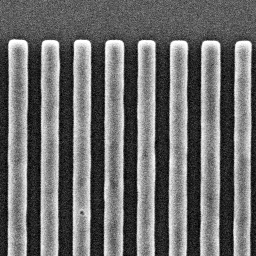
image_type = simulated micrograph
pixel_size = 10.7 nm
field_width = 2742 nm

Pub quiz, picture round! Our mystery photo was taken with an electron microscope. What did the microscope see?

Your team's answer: wiring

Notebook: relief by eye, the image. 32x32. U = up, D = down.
DDDDDDDDDDDDDDDDDDDDDDDDDDDDDDDD
DDDDDDDDDDDDDDDDDDDDDDDDDDDDDDDD
DDDDDDDDDDDDDDDDDDDDDDDDDDDDDDDD
DDDDDDDDDDDDDDDDDDDDDDDDDDDDDDDD
DDDDDDDDDDDDDDDDDDDDDDDDDDDDDDDD
DUUDDUUDDUUDDUUDDUUDDUUDDUUDDDUD
DUUDDUUDDUUDDUUDDUUDDUUDDUUDDUUD
DUUDDUUDDUUDDUUDDUUDDUUDDUUDDUUD
DUUDDUUDDUUDDUUDDUUDDUUDDUUDDUUD
DUUDDUUDDUUDDUUDDUUDDUUDDUUDDUUD
DUUDDUUDDUUDDUUDDUUDDUUDDUUDDUUD
DUUDDUUDDUUDDUUDDUUDDUUDDUUDDUUD
DUUDDUUDDUUDDUUDDUUDDUUDDUUDDUUD
DUUDDUUDDUUDDUUDDUUDDUUDDUUDDUUD
DUUDDUUDDUUDDUUDDUUDDUUDDUUDDUUD
DUUDDUUDDUUDDUUDDUUDDUUDDUUDDUUD
DUUDDUUDDUUDDUUDDUUDDUUDDUUDDUUD
DUUDDUUDDUUDDUUDDUUDDUUDDUUDDUUD
DUUDDUUDDUUDDUUDDUUDDUUDDUUDDUUD
DUUDDUUDDUUDDUUDDUUDDUUDDUUDDUUD
DUUDDUUDDUUDDUUDDUUDDUUDDUUDDUUD
DUUDDUUDDUUDDUUDDUUDDUUDDUUDDUUD
DUUDDUUDDUUDDUUDDUUDDUUDDUUDDUUD
DUUDDUUDDUUDDUUDDUUDDUUDDUUDDUUD
DUUDDUUDDUUDDUUDDUUDDUUDDUUDDUUD
DUUDDUUDDUUDDUUDDUUDDUUDDUUDDUUD
DUUDDUUDDUUDDUUDDUUDDUUDDUUDDUUD
DUUDDUUDDUUDDUUDDUUDDUUDDUUDDUUD
DUUDDUUDDUUDDUUDDUUDDUUDDUUDDUUD
DUUDDUUDDUUDDUUDDUUDDUUDDUUDDUUD
DUUDDUUDDUUDDUUDDUUDDUUDDUUDDUUD
DUUDDUUDDUUDDUUDDUUDDUUDDUUDDUUD